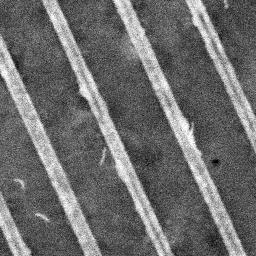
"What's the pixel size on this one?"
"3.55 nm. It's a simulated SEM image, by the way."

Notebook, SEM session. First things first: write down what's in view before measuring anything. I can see one or a few lines or trenches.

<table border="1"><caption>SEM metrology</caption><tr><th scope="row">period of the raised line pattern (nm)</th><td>233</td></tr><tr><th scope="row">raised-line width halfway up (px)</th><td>13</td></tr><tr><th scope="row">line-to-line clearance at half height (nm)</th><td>187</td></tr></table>